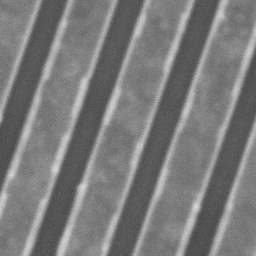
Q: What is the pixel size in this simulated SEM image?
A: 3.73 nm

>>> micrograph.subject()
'one or a few lines or trenches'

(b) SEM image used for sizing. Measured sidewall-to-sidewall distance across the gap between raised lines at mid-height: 27.9 pixels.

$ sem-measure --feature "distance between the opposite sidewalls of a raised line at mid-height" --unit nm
168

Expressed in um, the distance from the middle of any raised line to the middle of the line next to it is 0.272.